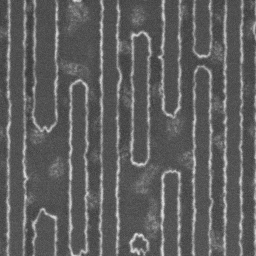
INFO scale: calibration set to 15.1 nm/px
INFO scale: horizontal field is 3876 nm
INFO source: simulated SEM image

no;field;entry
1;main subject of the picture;parallel lines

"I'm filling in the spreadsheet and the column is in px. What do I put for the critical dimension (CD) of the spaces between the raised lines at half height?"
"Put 14.4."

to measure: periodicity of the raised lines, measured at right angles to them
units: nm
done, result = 469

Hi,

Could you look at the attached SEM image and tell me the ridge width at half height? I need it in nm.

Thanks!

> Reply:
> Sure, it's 254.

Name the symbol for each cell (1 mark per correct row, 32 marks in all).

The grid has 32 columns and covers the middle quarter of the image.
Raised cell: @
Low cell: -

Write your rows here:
---------@@@@----@@@@----@@@@---
---------@@@@@---@@@@----@@@@---
---------@@@@@---@@@@----@@@@---
---------@@@@@---@@@@----@@@@---
---@@----@@@@@---@@@@----@@@@---
--@@@----@@@@@---@@@@----@@@@---
--@@@@---@@@@@---@@@@----@@@@---
--@@@-----@@@@---@@@@----@@@@---
--@@@@---@@@@@---@@@@----@@@@---
--@@@@---@@@@@---@@@@----@@@@---
--@@@----@@@@----@@@@----@@@@---
--@@@@---@@@@----@@@@----@@@----
--@@@@---@@@@----@@@@-----@@----
--@@@@---@@@@----@@@@-----------
--@@@@---@@@@----@@@@-----------
--@@@@---@@@@----@@@@-----------
--@@@@---@@@@@---@@@@-----------
--@@@@---@@@@@---@@@@-----------
--@@@@----@@@@---@@@@-----------
--@@@@---@@@@----@@@@-----------
--@@@@---@@@@----@@@@-----------
--@@@@---@@@@@---@@@@-----------
--@@@----@@@@@---@@@@-----------
--@@@----@@@@@---@@@@-----------
--@@@----@@@@@---@@@@-----------
--@@@@----@@@@------------------
--@@@@----@@@@------------------
--@@@@---@@@@------------@@@@---
--@@@@---@@@@------------@@@@---
--@@@@---@@@@------------@@@@---
--@@@@---@@@@------------@@@@---
--@@@@----@@@------------@@@@---